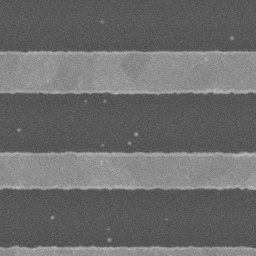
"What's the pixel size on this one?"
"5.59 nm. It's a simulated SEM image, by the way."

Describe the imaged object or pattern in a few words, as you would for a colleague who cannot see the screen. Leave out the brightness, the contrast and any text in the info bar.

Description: lines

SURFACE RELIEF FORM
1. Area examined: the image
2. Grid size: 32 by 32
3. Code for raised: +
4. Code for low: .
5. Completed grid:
................................
................................
................................
................................
................................
................................
+++.++++++++++++++.+++++++++++++
++++++++++++++++++++++++++++++++
++++++++++++++++++++++++++++++++
++++++++++++++++++++++++++++++++
++++++++++++++++++++++++++++++++
++++++++++++++++++++++++++++++++
................................
................................
................................
................................
................................
................................
................................
++++++++++++++++++++++++++++++++
++++++++++++++++++++++++++++++++
++++++++++++++++++++++++++++++++
++++++++++++++++++++++++++++++++
+.++++++++++++.++++.+++++++++.++
................................
................................
................................
................................
................................
................................
................................
++++++++++++++++++++++++++++++++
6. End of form